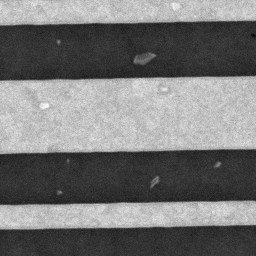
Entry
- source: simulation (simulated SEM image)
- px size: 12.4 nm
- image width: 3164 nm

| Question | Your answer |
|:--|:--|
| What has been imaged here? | groups of lines, slits or small figures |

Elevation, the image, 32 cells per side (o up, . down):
oooooooooooooooooooooooooooooooo
oooooooooooooooooooooooooooooooo
oooooooooooooooooooooooooooooo..
................................
................................
................................
................................
................................
................................
................................
oooooooooooooooooooooooooooooooo
oooooooooooooooooooooooooooooooo
oooooooooooooooooooooooooooooooo
oooooooooooooooooooooooooooooooo
oooooooooooooooooooooooooooooooo
oooooooooooooooooooooooooooooooo
oooooooooooooooooooooooooooooooo
oooooooooooooooooooooooooooooooo
oooooooooooooooooooooooooooooooo
................................
................................
................................
................................
................................
................................
............oooooooooooooooooooo
oooooooooooooooooooooooooooooooo
oooooooooooooooooooooooooooooooo
ooooo...........................
................................
................................
................................